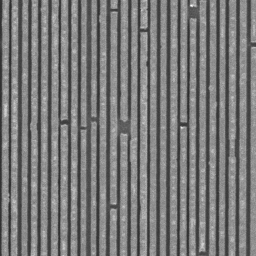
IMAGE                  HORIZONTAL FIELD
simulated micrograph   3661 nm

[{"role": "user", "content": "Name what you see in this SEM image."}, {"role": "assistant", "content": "parallel lines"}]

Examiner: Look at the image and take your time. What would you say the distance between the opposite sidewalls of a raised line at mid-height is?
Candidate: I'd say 0.0912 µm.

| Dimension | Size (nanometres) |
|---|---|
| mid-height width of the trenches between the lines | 51.8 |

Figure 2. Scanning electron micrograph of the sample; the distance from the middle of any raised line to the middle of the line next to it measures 142 nanometres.